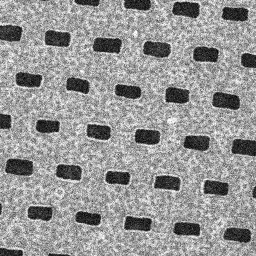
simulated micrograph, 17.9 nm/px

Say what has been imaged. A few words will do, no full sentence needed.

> a regular array of holes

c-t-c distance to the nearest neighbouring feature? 0.878 micrometres